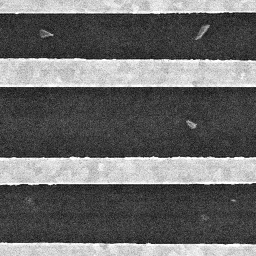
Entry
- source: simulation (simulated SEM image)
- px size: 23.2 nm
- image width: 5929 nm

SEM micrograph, lines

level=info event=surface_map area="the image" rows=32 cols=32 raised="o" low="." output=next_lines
oooooooooooooooooooooooooooooooo
oooooooooooooooooooooooooooo....
................................
................................
................................
................................
................................
ooooooooooo...o.................
oooooooooooooooooooooooooooooooo
oooooooooooooooooooooooooooooooo
oooooooooooooooooooooooooooooooo
................................
................................
................................
................................
................................
................................
................................
................................
................................
oooooooooooooooooooooooooooooooo
oooooooooooooooooooooooooooooooo
oooooooooooooooooooooooooooooooo
................................
................................
................................
................................
................................
................................
................................
ooooooooooooo.oo..o.............
oooooooooooooooooooooooooooooooo